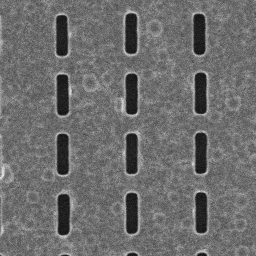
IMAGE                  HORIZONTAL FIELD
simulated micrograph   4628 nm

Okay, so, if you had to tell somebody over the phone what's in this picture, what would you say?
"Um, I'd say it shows a regular array of holes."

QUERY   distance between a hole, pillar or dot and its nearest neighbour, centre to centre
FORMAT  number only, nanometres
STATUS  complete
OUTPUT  1070